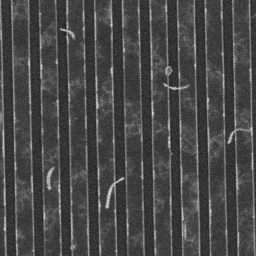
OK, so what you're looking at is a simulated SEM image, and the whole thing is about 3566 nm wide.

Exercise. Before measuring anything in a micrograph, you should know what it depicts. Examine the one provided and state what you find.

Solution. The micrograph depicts parallel lines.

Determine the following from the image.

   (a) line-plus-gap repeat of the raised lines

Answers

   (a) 27.6 px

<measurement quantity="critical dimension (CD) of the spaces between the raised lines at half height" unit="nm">150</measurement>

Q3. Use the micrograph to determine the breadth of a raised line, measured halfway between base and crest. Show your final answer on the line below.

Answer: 235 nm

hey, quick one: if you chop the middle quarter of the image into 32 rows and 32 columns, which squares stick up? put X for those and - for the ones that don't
-XXXX---XXXX---XXXX---XXXX---XXX
-XXXX---XXXX---XXXX---XXXXX--XXX
-XXXX---XXXX---XXXX---XXXX---XXX
-XXXX---XXXX---XXXX---XXXX---XXX
-XX-X---XXXX---XXXX---XXXX---XXX
-XXXX---XXXX---XXXX---XXXX---XXX
-XXXX---XX-X---XXXX---XXXX---XXX
-XXXX---XXXX---XXXX---XXXX---XXX
-XXXX---XXXX---XXXX---XXXX---XXX
-XXXX---X------XXXX---XXXX---XXX
-XXXX---X-XX---XXXX---XXXX---XXX
-XXXX---XXXX---XXXX---XXXX---XXX
-XXXX---XXXX---XX-X---XXXX---XXX
-XXXX---X-XX---XX-----XXXX---XXX
-XXXX---XXXX---XXXX---XXXX---XXX
-XXXX---XXXX----XXX---XXXX---XXX
--XXX---XXXX---XXXX---XXXX---XXX
--XXXX--XXXX---XXXX---XXXX---XXX
--XXXX--XXXX---XXXX---XXXX---XXX
--XXXX--XXXX---XXXX---XXXX---XXX
--XXXX--XXXXX--XXXX---XXXX---XXX
--XXXX---XXXX--XXXX---XXXXX--XXX
--XXXX---XXXX--XXXX---XXXXX--XXX
--XXXX---XXXX---XXX---XXXX---XXX
--XXXX---XXXX---XXXX--XXXX---XXX
--XXXX---XXXX---XXXX--X-XX---XXX
--XXXX---XXXX---XXXX--XXXX---XXX
--X--X---XXXX---XXXX---XXXX--XXX
--XXXX---XXXX---XXXX---XXXX--XXX
--XXXX---XXXX---XXXX---XXXX--XXX
--XXXX---XXXX---XXXX---XXXX--XXX
--XXXX---XXXX---XXXX---XXXX--XXX